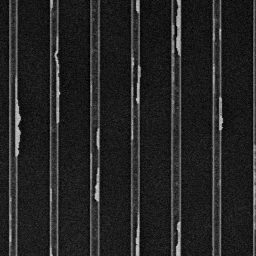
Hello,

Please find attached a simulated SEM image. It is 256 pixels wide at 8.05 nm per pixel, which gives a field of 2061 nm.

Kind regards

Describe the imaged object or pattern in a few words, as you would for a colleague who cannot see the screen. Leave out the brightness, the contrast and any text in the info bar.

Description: parallel lines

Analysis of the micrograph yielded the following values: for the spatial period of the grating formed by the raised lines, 328 nanometres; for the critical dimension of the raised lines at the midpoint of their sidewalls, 66.5 nm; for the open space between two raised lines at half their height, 0.258 micrometres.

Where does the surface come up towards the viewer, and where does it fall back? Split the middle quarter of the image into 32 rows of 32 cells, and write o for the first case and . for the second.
.......oo........oo........oo...
.......oo........oo........oo...
.......oo........oo........oo...
.......oo........oo........oo...
.......oo........oo........oo...
.......oo........oo........oo...
.......oo........oo........oo...
.......oo........oo........oo...
.......oo........oo........oo...
.......oo........oo........oo...
.......oo........oo........oo...
.......oo........oo........oo...
.......oo........oo........oo...
.......oo........oo........oo...
.......oo........oo........oo...
.......oo........oo........oo...
.......oo........oo........oo...
.......oo........oo........oo...
.......oo........oo........oo...
.......oo........oo........oo...
.......oo........oo........oo...
.......oo........oo........oo...
.......oo........oo........oo...
.......oo........oo........oo...
.......oo........oo........oo...
.......oo........oo........oo...
.......oo........oo........oo...
.......oo........oo........oo...
.......oo........oo........oo...
.......oo........oo........oo...
.......oo........oo........oo...
.......oo........oo........oo...